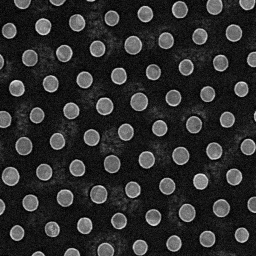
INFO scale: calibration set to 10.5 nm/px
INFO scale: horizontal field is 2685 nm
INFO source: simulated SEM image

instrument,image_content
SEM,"a regular array of raised bodies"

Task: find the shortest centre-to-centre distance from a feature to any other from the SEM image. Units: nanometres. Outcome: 346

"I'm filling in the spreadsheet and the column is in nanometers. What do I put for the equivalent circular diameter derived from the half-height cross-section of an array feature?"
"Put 164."